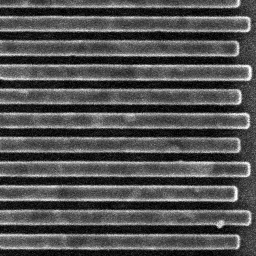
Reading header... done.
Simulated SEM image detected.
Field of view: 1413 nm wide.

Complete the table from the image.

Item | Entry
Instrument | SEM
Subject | parallel lines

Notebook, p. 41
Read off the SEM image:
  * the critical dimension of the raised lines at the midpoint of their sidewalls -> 79.3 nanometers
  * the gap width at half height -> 0.0559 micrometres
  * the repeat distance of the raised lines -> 0.134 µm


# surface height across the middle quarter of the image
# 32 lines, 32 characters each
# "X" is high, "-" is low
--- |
XXXXXXXXXXX---------------------
XXXXXXXXXXXXXXXXXXXXXXXXXXXXXXXX
XXXXXXXXXXXXXXXXXXXXXXXXXXXXXXXX
XXXXXXXXXXXXXXXXXXXXXXXXXXXXXXXX
--------------------------------
--------------------------------
XXXXXXXXXXXXXXXXXXXXXXXXXXXXXXXX
XXXXXXXXXXXXXXXXXXXXXXXXXXXXXXXX
XXXXXXXXXXXXXXXXXXXXXXXXXXXXXXXX
XXXXXXXXXXXXXXXXXXXXXXXXXXXXXXXX
--------------------------------
--------------------------------
--------------------------------
XXXXXXXXXXXXXXXXXXXXXXXXXXXXXXXX
XXXXXXXXXXXXXXXXXXXXXXXXXXXXXXXX
XXXXXXXXXXXXXXXXXXXXXXXXXXXXXXXX
--------------------------------
--------------------------------
XXXXX-----------------XXXX--XXX-
XXXXXXXXXXXXXXXXXXXXXXXXXXXXXXXX
XXXXXXXXXXXXXXXXXXXXXXXXXXXXXXXX
XXXXXXXXXXXXXXXXXXXXXXXXXXXXXXXX
--------------------------------
--------------------------------
----------------------------XX--
XXXXXXXXXXXXXXXXXXXXXXXXXXXXXXXX
XXXXXXXXXXXXXXXXXXXXXXXXXXXXXXXX
XXXXXXXXXXXXXXXXXXXXXXXXXXXXXXXX
--------------------------------
--------------------------------
--------------------------------
XXXXXXXXXXXXXXXXXXXXXXXXXXXXXXXX